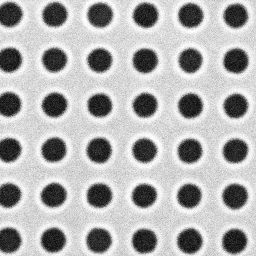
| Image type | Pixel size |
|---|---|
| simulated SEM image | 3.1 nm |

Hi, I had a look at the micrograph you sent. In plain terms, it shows a regular array of holes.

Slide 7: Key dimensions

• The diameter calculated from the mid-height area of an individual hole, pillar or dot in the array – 84.7 nanometers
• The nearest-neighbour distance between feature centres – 0.14 micrometres